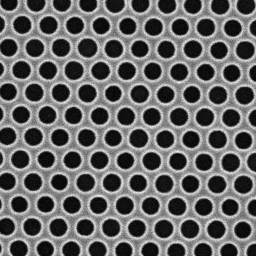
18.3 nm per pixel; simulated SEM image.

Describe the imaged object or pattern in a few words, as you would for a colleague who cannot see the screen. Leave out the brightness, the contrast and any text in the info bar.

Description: a regular array of holes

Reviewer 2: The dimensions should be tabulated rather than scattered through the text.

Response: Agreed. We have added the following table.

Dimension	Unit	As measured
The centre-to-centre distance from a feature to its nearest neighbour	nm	469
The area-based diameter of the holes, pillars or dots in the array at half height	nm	337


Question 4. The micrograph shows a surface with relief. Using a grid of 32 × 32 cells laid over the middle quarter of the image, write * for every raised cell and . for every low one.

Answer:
.....**....***....**....***....*
.....**.....**....**....***....*
.....**....**.....**....**.....*
*...****...***...****...***....*
********************************
.***...****..*****..*****.*****.
.***....**....***....***...***..
.**.....**.....**....**.....**..
.***....***...***....**.....**..
*****..***********..****...****.
********************************
*...***....***...***....***...**
.....**....**.....**....***....*
....***....**.....**....**.....*
*...***....***....**....***....*
****************************.***
****...****..****...*****.******
.***....**....***....**....***..
.**.....**.....*.....**.....**..
.***....**....**.....**.....**..
*****..****..****...****...***..
********************************
*...***....***...***....***...**
....***....**.....**....**.....*
....***....**.....**....**.....*
....***....***...***....**....**
***************.*****.******.***
****..*****..*****.*************
.**.....**....***...***....***..
.**.....**....**.....**....**...
.**.....**....**.....**....**...
****...***...****...***....***..